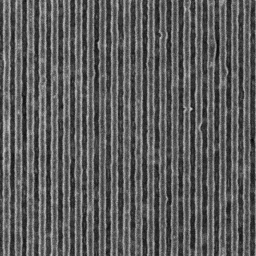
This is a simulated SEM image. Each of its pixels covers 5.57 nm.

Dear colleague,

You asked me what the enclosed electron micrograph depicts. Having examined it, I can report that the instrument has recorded parallel lines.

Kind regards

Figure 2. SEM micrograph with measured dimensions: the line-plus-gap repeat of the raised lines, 66.9 nm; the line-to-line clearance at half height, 30.7 nm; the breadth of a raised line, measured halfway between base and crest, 36.2 nm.